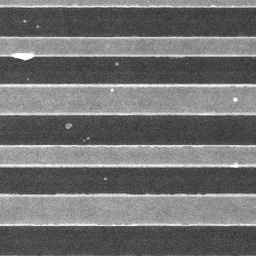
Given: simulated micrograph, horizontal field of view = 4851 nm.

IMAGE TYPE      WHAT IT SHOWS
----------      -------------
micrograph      lines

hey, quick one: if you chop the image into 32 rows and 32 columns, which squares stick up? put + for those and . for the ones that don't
++++++++++++++++++++++++++++++++
................................
................................
................................
................................
++++++++++++++++++++++++++++++++
++++++++++++++++++++++++++++++++
................................
................................
................................
................................
++++++++++++++++++++++++++++++++
++++++++++++++++++++++++++++++++
++++++++++++++++++++++++++++++++
................................
................................
................................
................................
++++++++++++++++++++++++++++++++
++++++++++++++++++++++++++++++++
++++++++++++++++++++++++++++++++
................................
................................
................................
+......+..+++++++.++++++++++++++
++++++++++++++++++++++++++++++++
++++++++++++++++++++++++++++++++
++++++++++++++++++++++++++++++++
................................
................................
................................
................................